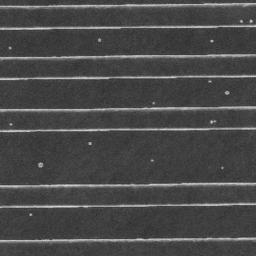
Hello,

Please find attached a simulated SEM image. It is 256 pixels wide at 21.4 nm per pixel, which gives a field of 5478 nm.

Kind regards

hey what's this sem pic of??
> lines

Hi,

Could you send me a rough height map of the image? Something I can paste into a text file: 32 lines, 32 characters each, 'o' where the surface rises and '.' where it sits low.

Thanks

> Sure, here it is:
.............................ooo
oooooooooooooooooooooooooooooooo
oooooooooooooooooooooooooooooooo
oooooooooooo....................
................................
................................
................................
oooooooooooooooooooooooooooooooo
oooooooooooooooooooooooooooooooo
oooooooooooooooooooooooooooooo..
................................
................................
................................
..............................oo
oooooooooooooooooooooooooooooooo
oooooooooooooooooooooooooooooooo
................................
................................
................................
................................
................................
................................
................................
oooooooooooooooooooooooooooooooo
oooooooooooooooooooooooooooooooo
oooooooooooooooooooooooooooooooo
................................
................................
................................
................................
oooooooooooooooooooooooooooooooo
oooooooooooooooooooooooooooooooo